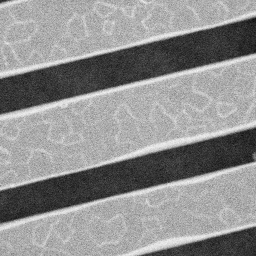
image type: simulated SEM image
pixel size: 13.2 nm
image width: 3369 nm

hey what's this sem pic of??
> lines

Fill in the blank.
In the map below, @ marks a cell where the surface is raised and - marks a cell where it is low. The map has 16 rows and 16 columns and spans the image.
@@@@@@@@@@@@@@@@
@@@@@@@@@@@@@@--
@@@@@@@@@@------
@@@@@@---------@
@----------@@@@@
-------@@@@@@@@@
---@@@@@@@@@@@@@
@@@@@@@@@@@@@@@@
@@@@@@@@@@@@@@--
@@@@@@@@@-------
@@@@@@---------@
@@---------@@@@@
------@@@@@@@@@@
--@@@@@@@@@@@@@@
@@@@@@@@@@@@@@--
@@@@@@@@@@------